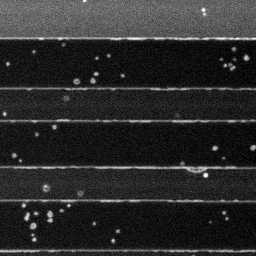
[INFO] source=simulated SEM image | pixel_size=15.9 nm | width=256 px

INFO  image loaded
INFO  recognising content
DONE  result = lines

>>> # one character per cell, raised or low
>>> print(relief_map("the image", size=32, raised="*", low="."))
................................
................................
................................
................................
................................
********************************
********************************
********************************
********************************
********************************
********************************
................................
................................
................................
................................
********************************
********************************
********************************
********************************
********************************
********************************
................................
................................
................................
................................
********************************
********************************
********************************
********************************
********************************
********************************
................................